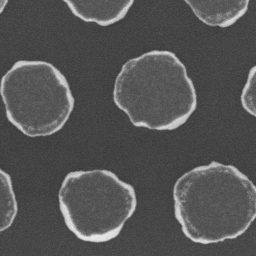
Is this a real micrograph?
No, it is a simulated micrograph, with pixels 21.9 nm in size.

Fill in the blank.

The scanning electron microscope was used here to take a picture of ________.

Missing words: raised bodies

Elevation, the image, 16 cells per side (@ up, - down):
----@@@@----@@@-
-------------@--
----------------
---------@@-----
-@@@----@@@@----
@@@@---@@@@@---@
@@@@---@@@@@---@
-@@@----@@@-----
----------------
----------------
-------------@--
@---@@@@---@@@@@
@---@@@@---@@@@@
@---@@@@---@@@@@
-----@@-----@@@-
----------------